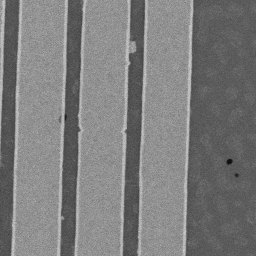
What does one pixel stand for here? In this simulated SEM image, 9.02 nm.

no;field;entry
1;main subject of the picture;parallel lines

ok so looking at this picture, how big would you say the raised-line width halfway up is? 410 nanometers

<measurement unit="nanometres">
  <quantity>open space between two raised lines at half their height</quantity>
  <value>152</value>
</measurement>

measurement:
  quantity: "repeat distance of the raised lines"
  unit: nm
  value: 566